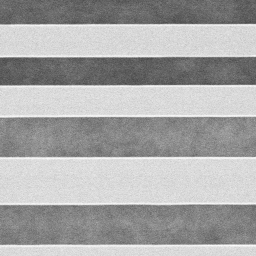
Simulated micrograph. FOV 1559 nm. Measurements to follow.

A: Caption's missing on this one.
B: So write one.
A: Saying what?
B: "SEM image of groups of lines, slits or small figures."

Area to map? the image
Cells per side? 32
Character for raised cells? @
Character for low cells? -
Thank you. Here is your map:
--------------------------------
--------------------------------
--------------------------------
@@@@@@@@@@@@@@@@@@@@@@@@@@@@@@@@
@@@@@@@@@@@@@@@@@@@@@@@@@@@@@@@@
@@@@@@@@@@@@@@@@@@@@@@@@@@@@@@@@
@@@@@@@@@@@@@@@@@@@@@@@@@@@@@@@@
--------------------------------
--------------------------------
--------------------------------
--------------------------------
@@@@@@@@@@@@@@@@@@@@@@@@@@@@@@@@
@@@@@@@@@@@@@@@@@@@@@@@@@@@@@@@@
@@@@@@@@@@@@@@@@@@@@@@@@@@@@@@@@
@@@@----------------------------
--------------------------------
--------------------------------
--------------------------------
--------------------------------
--------------------------------
@@@@@@@@@@@@@@@@@@@@@@@@@@@@@@@@
@@@@@@@@@@@@@@@@@@@@@@@@@@@@@@@@
@@@@@@@@@@@@@@@@@@@@@@@@@@@@@@@@
@@@@@@@@@@@@@@@@@@@@@@@@@@@@@@@@
@@@@@@@@@@@@@@@@@@@@@@@@@@@@@@@@
@@@@@@@@@@@@@@@@--@@@@@---------
--------------------------------
--------------------------------
--------------------------------
--------------------------------
--------------------------------
@@@@@@@@@@@@@@@@@@@@@@@@@@@@@@@@